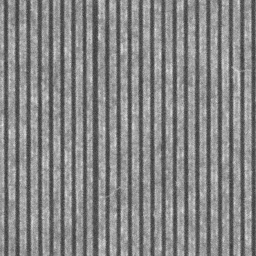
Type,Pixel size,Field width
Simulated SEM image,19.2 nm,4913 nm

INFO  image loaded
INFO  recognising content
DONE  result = parallel lines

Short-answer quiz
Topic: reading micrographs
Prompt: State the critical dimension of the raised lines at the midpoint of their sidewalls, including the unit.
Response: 0.122 micrometres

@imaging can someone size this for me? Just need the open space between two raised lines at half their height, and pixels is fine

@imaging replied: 4.63